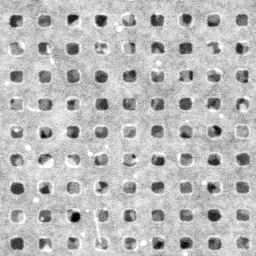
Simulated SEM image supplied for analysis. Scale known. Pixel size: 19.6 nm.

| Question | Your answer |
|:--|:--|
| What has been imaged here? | a regular array of raised bodies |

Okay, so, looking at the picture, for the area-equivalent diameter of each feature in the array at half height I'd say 302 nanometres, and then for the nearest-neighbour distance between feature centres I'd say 0.542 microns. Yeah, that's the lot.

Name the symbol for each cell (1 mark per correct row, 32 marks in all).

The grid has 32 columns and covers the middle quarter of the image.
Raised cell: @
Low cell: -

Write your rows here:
--------------------------------
-@@-----@------@@@----@@-----@@@
-@@@----@@@----@@@----@@@----@@@
-@@@----@@@----@@@----@@@----@@@
-@@@----@@@----@@@----@@@----@@@
--------------------------------
--------------------------------
--------------------------------
-@@-----@@------@-----@@-----@@@
@@@@----@@@----@@@----@@@----@@@
-@@@----@@@----@@@----@@@----@@@
-@@@----@@@----@@@----@@@----@@@
--------------------------------
--------------------------------
--------------------------------
-@@@----@------@@@----@@@----@@@
@@@@----@@@----@@@----@@@----@@@
-@@@----@@@----@@@----@@@----@@@
-@@-----@@@----@@@-----@@----@@@
--------------------------------
--------------------------------
--------------------------------
-@@-----@@@----@@@----@@@----@@@
-@@@----@@@----@@@----@@@----@@@
-@@@----@@@----@@@----@@@----@@@
-@@@----@@@----@@@-----@@----@@-
--------------------------------
--------------------------------
--------------------------------
-@@@----@@@----@@@----@@@----@@@
-@@@----@@@----@@@----@@@----@@@
-@@@----@@@----@@@----@@@----@@@